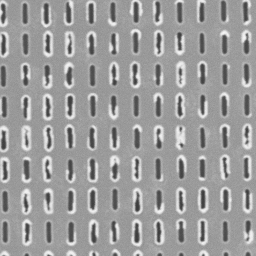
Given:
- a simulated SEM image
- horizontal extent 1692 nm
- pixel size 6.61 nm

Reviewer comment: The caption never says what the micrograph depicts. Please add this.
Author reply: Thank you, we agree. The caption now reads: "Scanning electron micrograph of a regular array of holes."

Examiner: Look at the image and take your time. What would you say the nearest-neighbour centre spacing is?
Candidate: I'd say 21.8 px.